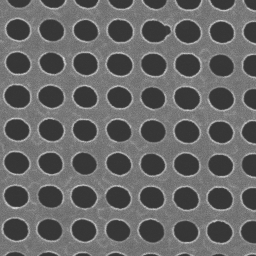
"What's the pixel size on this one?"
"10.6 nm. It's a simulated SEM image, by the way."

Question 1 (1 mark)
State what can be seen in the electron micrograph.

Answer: a regular array of holes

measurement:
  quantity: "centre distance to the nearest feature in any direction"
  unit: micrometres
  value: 0.354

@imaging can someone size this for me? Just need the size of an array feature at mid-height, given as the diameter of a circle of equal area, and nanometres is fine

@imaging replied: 250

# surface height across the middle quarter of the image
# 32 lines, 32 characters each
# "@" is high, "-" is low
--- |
@@-------@@------@@-------@@----
@@@-----@@@------@@@-----@@@----
@@@@---@@@@@----@@@@@----@@@@---
@@@@@@@@@@@@@@@@@@@@@@@@@@@@@@@@
@@@@@@@@@@@@@@@@@@@@@@@@@@@@@@@@
@@@@@@@@@@@@@@@@@@@@@@@@@@@@@@@@
@@@----@@@@@----@@@@----@@@@----
@@------@@@------@@------@@@----
@@------@@@------@@------@@@----
@@@-----@@@------@@@-----@@@----
@@@@---@@@@@----@@@@-----@@@@---
@@@@@@@@@@@@@@@@@@@@@@@@@@@@@@--
@@@@@@@@@@@@@@@@@@@@@@@@@@@@@@@@
@@@@@@@@@@@@@@@@@@@@@@@@@@@@@@@@
@@@----@@@@@----@@@@----@@@@@---
@@------@@@-----@@@------@@@----
@@------@@@------@@------@@-----
@@------@@@------@@------@@@----
@@@----@@@@@----@@@@-----@@@----
@@@@@@@@@@@@@@@@@@@@@---@@@@@@--
@@@@@@@@@@@@@@@@@@@@@@@@@@@@@@@@
@@@@@@@@@@@@@@@@@@@@@@@@@@@@@@@@
@@@---@@@@@@---@@@@@@-@@@@@@@---
@@------@@@-----@@@@----@@@@----
@@------@@@------@@------@@@----
@@------@@@------@@------@@@----
@@@-----@@@-----@@@@-----@@@----
@@@@--@@@@@@@--@@@@@@---@@@@@---
@@@@@@@@@@@@@@@@@@@@@@@@@@@@@@@@
@@@@@@@@@@@@@@@@@@@@@@@@@@@@@@@@
@@@@--@@@@@@@@@@@@@@@@@@@@@@@@@@
@@-----@@@@-----@@@-----@@@@----